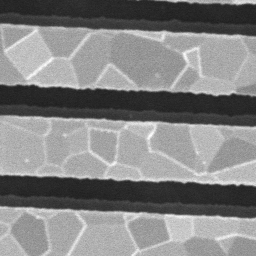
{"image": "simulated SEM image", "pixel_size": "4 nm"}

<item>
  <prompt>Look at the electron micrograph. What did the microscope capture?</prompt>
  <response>lines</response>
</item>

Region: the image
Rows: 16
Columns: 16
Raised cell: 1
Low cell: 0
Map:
0000000000000000
0000000000000000
1111111111111111
1111111111111111
1111111111111111
0000011111111111
0000000000000000
1111110000000000
1111111111111111
1111111111111111
1111111111111111
0000000000000011
0000000000000000
1111111111111000
1111111111111111
1111111111111111